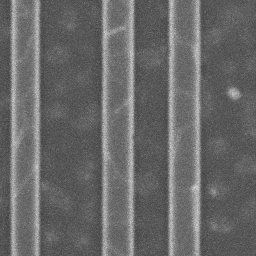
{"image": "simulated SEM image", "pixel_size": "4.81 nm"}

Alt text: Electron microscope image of one or a few lines or trenches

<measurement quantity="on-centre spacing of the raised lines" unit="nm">382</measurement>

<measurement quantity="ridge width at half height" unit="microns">0.141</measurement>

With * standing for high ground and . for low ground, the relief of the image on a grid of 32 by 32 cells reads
..***........****....****.......
..***........****....****.......
..***........***.....****.......
..***........***.....****.......
..***........***.....****.......
..***........***.....****.......
..***........***.....****.......
..***........***.....****.......
..***........****....****.......
..***........****....****.......
..***........***.....****.......
..***........***.....****....*..
..***........****....****.......
..***........****....****.......
..***........****....****.......
..***........****....****.......
..***........***.....****.......
..***........***.....****.......
..***........***.....****.......
..***........***.....****.......
..***........***.....****.......
..***........***.....****.......
..***........***.....****.......
..***........***.....****.......
..***........***.....****.......
..***........***.....****.......
..***........***.....****.......
..***........***.....****.......
..***........***.....****.......
..***........***.....****.......
..***........***.....****.......
..***........***.....****.......